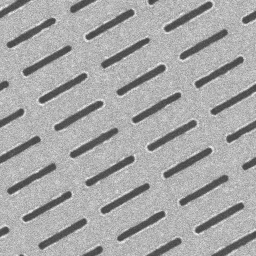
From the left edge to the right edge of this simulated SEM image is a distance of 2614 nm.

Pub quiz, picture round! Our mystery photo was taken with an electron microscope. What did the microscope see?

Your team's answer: a regular array of holes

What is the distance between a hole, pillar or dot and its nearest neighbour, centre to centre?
321 nanometres